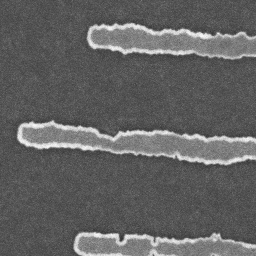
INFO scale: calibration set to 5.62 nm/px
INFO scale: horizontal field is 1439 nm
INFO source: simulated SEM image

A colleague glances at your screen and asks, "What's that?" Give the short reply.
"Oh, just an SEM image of one or a few lines or trenches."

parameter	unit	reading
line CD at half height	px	23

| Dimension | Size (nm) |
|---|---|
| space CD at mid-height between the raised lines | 456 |